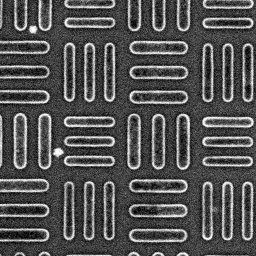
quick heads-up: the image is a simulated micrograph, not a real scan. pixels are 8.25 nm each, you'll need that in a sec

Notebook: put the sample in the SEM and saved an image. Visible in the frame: groups of lines, slits or small figures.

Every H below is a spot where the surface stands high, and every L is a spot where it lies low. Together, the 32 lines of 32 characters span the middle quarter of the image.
HHHLLHHLLLHHHLLLLLLLLLLLLLLLLLLL
HHHLLHHLLLHHHLLLLHHHHHHHHHHHHHHL
HHHLLHHLLLHHLLLLLHHHHHHHHHHHHHHL
HHHLLHHLLLHHLLLLLLLLLLLLLHHHHHLL
HHHLLHHLLLHHLLLLLLLLLLLLLLLLLLLL
HHHLLHHLLLHHLLLLLLLLLLLLLLLLLLLL
HHHLLHHLLLHHLLLLLLLLLLLLLLLLLLLL
HHLLLHHLLLHHLLLLLHHHHHHHHHHHHHHL
HHLLLHHLLLHHLLLLLHHHHHHHHHHHHHHL
LLLLLLLLLLLLLLLLLHHHHHHHHHHHHHLL
LLLLLLLLLLLLLLLLLLLLLLLLLLLLLLLL
LLLLLLLLLLLLLLLLLLLLLLLLLLLLLLLL
LLLLLLLLLLLLLLLLLLLLLLLLLLLLLLLL
LHHHHHHHHHHHLLLLHHHLLLHHHLLLHHHL
HHHHHHHHHHHHLLLLHHHLLLHHHLLLHHHL
LLLLLLLLHLLLLLLLHHHLLLHHHLLLHHHL
LLLLLLLLLLLLLLLLHHHLLLHHHLLLHHHL
LLLLLLLLLLLLLLLLHHHLLLHHHLLLHHHL
LHHHHHHHHHHHLLLLHHHLLLHHHLLLHHHL
HHHHHHHHHHHHLLLLHHHLLLHHHLLLHHHL
LLLLLLLLLLLLLLLLHHHLLLHHHLLLHHHL
LLLLLLLLLLLLLLLLHHHLLLHHHLLLHHHL
LLLLLLLLLLLLLLLLHHHLLLHHHLLLHHHL
LHHHHHHHHHHHLLLLHHHLLLHHHLLLHHHL
HHHHHHHHHHHHLLLLHHHLLLHHHLLLHHHL
LLLLLLLLLLLLLLLLHHHLLLHHHLLLLHHL
LLLLLLLLLLLLLLLLLLLLLLLLLLLLLLLL
LLLLLLLLLLLLLLLLLLLLLLLLLLLLLLLL
LLLLLLLLLLLLLLLLLLLLLLLLLLLLLLLL
LLLLLLLLLLLLLLLLLHHHHHHHHHHHHHLL
HHLLLHHLLLHHLLLLLHHHHHHHHHHHHHHL
HHLLLHHLLLHHLLLLLHHHHHHHHHHHHHLL